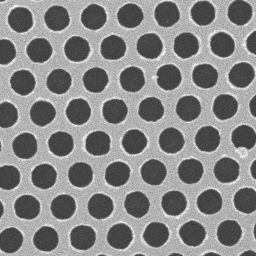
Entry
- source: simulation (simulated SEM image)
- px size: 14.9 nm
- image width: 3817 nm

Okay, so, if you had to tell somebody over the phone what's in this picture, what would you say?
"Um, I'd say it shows a regular array of holes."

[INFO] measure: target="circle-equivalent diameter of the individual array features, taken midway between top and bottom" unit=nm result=385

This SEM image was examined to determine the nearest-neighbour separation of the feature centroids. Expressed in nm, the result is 537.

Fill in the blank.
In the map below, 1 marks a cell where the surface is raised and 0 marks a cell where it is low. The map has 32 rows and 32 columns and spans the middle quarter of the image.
11111111111111111111111110001111
11111100001111100001111000000111
01111000000111000000111000000111
00111000000111000000111000000111
00111000000111000000111000000111
00111000000111000000111100000111
01111100001111100001111110011111
11111111111111111111111111111111
11111111111111111111100111111000
10000011110000011110000011110000
10000001110000001110000001110000
00000001100000001110000001110000
00000001110000001110000001110000
10000011110000011110000011111000
11000011111000111111111111111111
11111111111111111111111111111111
11111111111111110001111110000111
00111100000111100000111100000111
00111100000011100000011100000011
00111000000011100000011100000011
00011000000011100000011100000011
00111100000111100000111110000111
01111110000111110001111111111111
11111111111111111111111111111111
11100111111110011111000011111000
11000001111000001110000001111000
10000001110000000110000000110000
10000001110000000110000000110000
10000001110000001111000001111000
10000001111000001111000001111100
11000011111100111111110111111111
11111111111111111111111111111111